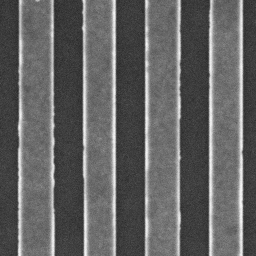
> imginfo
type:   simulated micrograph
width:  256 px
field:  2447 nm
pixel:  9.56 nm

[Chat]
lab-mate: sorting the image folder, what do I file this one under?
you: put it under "lines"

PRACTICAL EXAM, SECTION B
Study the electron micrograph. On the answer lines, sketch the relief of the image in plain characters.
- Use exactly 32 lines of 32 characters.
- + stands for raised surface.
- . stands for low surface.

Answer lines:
..+++++...++++....++++....++++..
..+++++...++++....++++....++++..
..+++++...++++....++++....++++..
..+++++...++++....++++....++++..
..+++++...++++....++++....++++..
..+++++...++++....++++....++++..
..+++++...++++....++++....++++..
..+++++...++++....++++....++++..
..+++++...++++....++++....++++..
..+++++...++++....++++....++++..
..+++++...++++....++++....++++..
..+++++...++++....++++....++++..
..+++++...++++....++++....++++..
..+++++...++++....++++....++++..
..+++++...++++....++++....++++..
..+++++...++++....++++....++++..
..+++++...++++....++++....++++..
..+++++...++++....++++....++++..
..+++++...++++....++++....++++..
..+++++...++++....++++....++++..
..+++++...++++....++++....++++..
..+++++...++++....++++....++++..
..+++++....+++....++++....++++..
..+++++....+++....++++....++++..
..+++++....+++....++++....++++..
..+++++....+++....++++....++++..
..+++++....+++....++++....++++..
..+++++....+++....++++....++++..
..+++++....+++....++++....++++..
..+++++....+++....++++....++++..
..+++++....+++....++++....++++..
..+++++....+++....++++....++++..